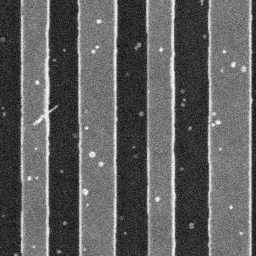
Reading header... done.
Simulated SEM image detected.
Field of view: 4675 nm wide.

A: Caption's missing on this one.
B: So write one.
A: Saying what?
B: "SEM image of lines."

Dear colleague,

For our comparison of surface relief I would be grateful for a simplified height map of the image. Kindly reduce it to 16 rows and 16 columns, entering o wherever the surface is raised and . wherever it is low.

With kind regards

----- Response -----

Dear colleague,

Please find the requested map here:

.oo..oo..oo..ooo
.oo..oo..oo..ooo
.oo..oo..oo..ooo
.oo..oo..oo..ooo
.oo..oo..oo..ooo
.oo..oo..oo..ooo
.oo..oo..oo..ooo
.oo..oo..oo..ooo
.oo..oo..oo..ooo
.oo..oo..oo..ooo
.oo..oo..oo..ooo
.oo..oo..oo..ooo
.oo..oo..oo..ooo
.oo..oo..oo..ooo
.oo..oo..oo..ooo
.oo..oo..oo..ooo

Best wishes